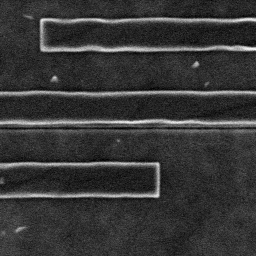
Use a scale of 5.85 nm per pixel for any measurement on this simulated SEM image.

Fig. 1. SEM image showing wiring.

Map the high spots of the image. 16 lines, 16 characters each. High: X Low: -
----------------
---XXXXXXXXXXXX-
---XXXXXXXXXXXX-
----------------
----------------
----------------
XXXXXXXXXXXXXXXX
XXXXXXXX-XXXXXXX
----------------
----------------
XXXXXXXXXX------
XXXXXXXXXX------
----------------
----------------
----------------
----------------